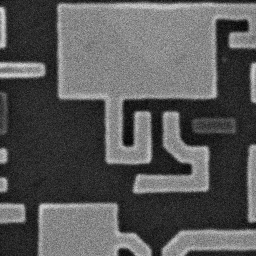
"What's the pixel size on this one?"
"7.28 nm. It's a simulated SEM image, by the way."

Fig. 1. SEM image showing wiring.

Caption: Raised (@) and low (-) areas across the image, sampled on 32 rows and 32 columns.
-----------------@@------@@-----
-------@@@@@@@@@@@@@@@@@@@@@@@@@
@------@@@@@@@@@@@@@@@@@@@@----@
@------@@@@@@@@@@@@@@@@@@@@----@
@------@@@@@@@@@@@@@@@@@@@@--@@@
@------@@@@@@@@@@@@@@@@@@@@--@@@
-------@@@@@@@@@@@@@@@@@@@@-----
-------@@@@@@@@@@@@@@@@@@@@-----
@@@@@--@@@@@@@@@@@@@@@@@@@@----@
@@@@@--@@@@@@@@@@@@@@@@@@@@----@
-------@@@@@@@@@@@@@@@@@@@@----@
-------@@@@@@@@@@@@@@@@@@@@----@
@------------@@@----------------
@------------@@-----------------
@------------@@--@@-@@----------
@------------@@--@@-@@--@@@@@---
@------------@@--@@-@@--@@@@@---
-------------@@--@@-@@@---------
-------------@@@@@@--@@@@@-----@
@------------@@@@@@---@@@@-----@
------------------------@@-----@
------------------------@@-----@
@----------------@@@@@@@@@-----@
@----------------@@@@@@@@@-----@
-------------------------------@
-------------------------------@
@@@--@@@@@@@@@@----------------@
@@@--@@@@@@@@@@----------------@
-----@@@@@@@@@@-----------------
-----@@@@@@@@@@@@-----@@@@@@@@@@
-----@@@@@@@@@@@@@---@@@@@@@@@@@
-----@@@@@@@@@@--@@-@@@---------